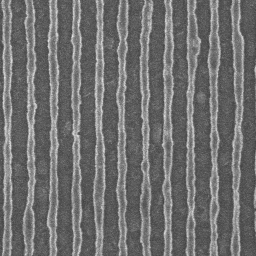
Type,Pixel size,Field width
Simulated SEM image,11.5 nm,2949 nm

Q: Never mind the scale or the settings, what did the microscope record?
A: parallel lines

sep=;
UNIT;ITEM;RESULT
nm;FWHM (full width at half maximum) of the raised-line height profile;72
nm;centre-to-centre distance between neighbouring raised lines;264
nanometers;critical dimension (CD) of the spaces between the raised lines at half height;186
